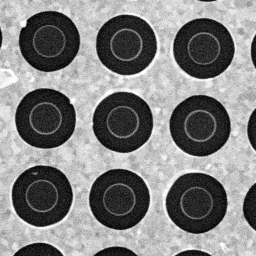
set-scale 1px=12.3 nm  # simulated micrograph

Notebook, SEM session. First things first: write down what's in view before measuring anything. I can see an array of small figures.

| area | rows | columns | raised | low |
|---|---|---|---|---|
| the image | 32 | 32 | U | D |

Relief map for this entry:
UUUUUUUUUUUUUUUUUUUUUUUUUUUUUUUU
UUUUUDDUUUUUUUUUUUUUUUUUUUUUUUUU
UUUDDDDDDUUUUUDDDDUUUUUUDDDUUUUU
UUUDDDDDDDUUUDDDDDDUUUUDDDDDUUUU
UUDDDDDDDDUUDDDDDDDDUUDDDDDDDUUU
UUDDDDDDDDUUDDDDDDDDUUDDDDDDDUUD
UUUDDDDDDDUUDDDDDDDDUDDDDDDDDUUD
UUUDDDDDDUUUDDDDDDDUUUDDDDDDDUUD
UUUUDDDDUUUUUDDDDDUUUUDDDDDDUUUU
UUUUUUUUUUUUUUUDDUUUUUUUDDDUUUUU
UUUUUUUUUUUUUUUUUUUUUUUUUUUUUUUU
UUUUDDDDUUUUUUDDDUUUUUUUUUUUUUUU
UUUDDDDDDUUUUDDDDDUUUUUDDDDUUUUU
UUDDDDDDDUUUDDDDDDDUUUDDDDDDUUUU
UUDDDDDDDDUUDDDDDDDUUDDDDDDDDUUD
UUDDDDDDDUUUDDDDDDDUUDDDDDDDDUUD
UUDDDDDDDUUUDDDDDDDUUDDDDDDDDUUD
UUUDDDDDDUUUDDDDDDDUUUDDDDDDUUUD
UUUUUDDUUUUUUDDDDDUUUUDDDDDDUUUU
UUUUUUUUUUUUUUUUUUUUUUUUDDUUUUUU
UUUUUUUUUUUUUUUUUUUUUUUUUUUUUUUU
UUUDDDDDUUUUUDDDDUUUUUUDDUUUUUUU
UUDDDDDDDUUUDDDDDDUUUUDDDDDUUUUU
UDDDDDDDDUUDDDDDDDDUUDDDDDDDUUUD
UDDDDDDDDUUDDDDDDDDUUDDDDDDDUUUD
UDDDDDDDDUUDDDDDDDDUUDDDDDDDUUDD
UUDDDDDDDUUDDDDDDDUUUDDDDDDDUUDD
UUUDDDDDUUUUDDDDDDUUUDDDDDDDUUUD
UUUUUUUUUUUUUUDDUUUUUUDDDDDUUUUU
UUUUUUUUUUUUUUUUUUUUUUUUUUUUUUUU
UUUUDDUUUUUUUUUUUUUUUUUUUUUUUUUU
UUDDDDDDUUUUDDDDDUUUUUDDDDUUUUUU